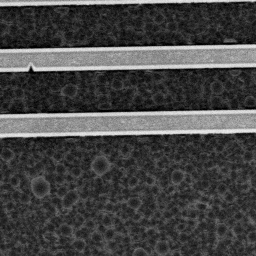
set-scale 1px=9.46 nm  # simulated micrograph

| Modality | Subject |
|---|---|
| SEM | one or a few lines or trenches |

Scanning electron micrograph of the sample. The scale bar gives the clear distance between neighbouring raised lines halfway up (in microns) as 0.436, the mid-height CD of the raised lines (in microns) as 0.181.